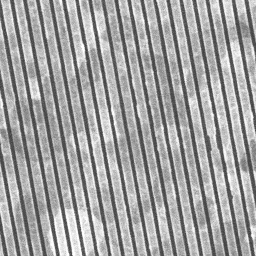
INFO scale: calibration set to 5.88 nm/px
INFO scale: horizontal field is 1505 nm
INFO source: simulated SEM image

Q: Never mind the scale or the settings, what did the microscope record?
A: parallel lines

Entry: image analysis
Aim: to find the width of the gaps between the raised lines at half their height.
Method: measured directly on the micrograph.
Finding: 23.9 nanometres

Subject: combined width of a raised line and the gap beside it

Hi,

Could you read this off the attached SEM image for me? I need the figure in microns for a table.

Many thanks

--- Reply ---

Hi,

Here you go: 0.0753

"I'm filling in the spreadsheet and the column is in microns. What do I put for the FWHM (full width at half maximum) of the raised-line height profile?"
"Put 0.0513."